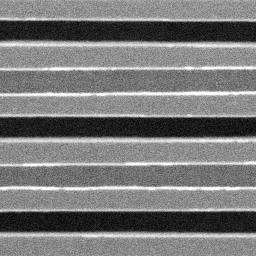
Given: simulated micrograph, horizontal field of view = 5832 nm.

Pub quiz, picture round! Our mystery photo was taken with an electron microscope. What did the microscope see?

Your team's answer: lines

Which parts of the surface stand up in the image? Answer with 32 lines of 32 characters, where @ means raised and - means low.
@@@@@@@@@@@@@@@@@@@@@@@@@@@@@@@@
@@@@@@@@@@@@@@@@@@@@@@@@@@@@@@@@
--------------------@@@@@@@@@@@@
--------------------------------
--------------------------------
--------------------------------
@@@@@@@@@@@@@@@@@@@@@@@@@@@@@@@@
@@@@@@@@@@@@@@@@@@@@@@@@@@@@@@@@
@@@@@@@@@@@@@@@@@@@@@@@@@@@@@@@@
@@@@@@@@@@@@@@@@@@@@@@@@@@@@@@@@
@@@@@@@@@@@@@@@@@@@@@@@@@@@@@@@@
@@@@@@@@@@@@@@@@@@@@@@@@@@@@@@@@
@@@@@@@@@@@@@@@@@@@@@@@@@@@@@@@@
@@@@@@@@@@@@@@@@@@@@@@@@@@@@@@@@
------------@@-@@@@@@@@@@@@@@@@@
--------------------------------
--------------------------------
--------------------------------
@@@@@@@@@@@@@@@@@@@@@@@@@@@@@@@@
@@@@@@@@@@@@@@@@@@@@@@@@@@@@@@@@
@@@@@@@@@@@@@@@@@@@@@@@@@@@@@@@@
@@@@@@@@@@@@@@@@@@@@@@@@@@@@@@@@
@@@@@@@@@@@@@@@@@@@@@@@@@@@@@@@@
@@@@@@@@@@@@@@@@@@@@@@@@@@@@@@@@
@@@@@@@@@@@@@@@@@@@@@@@@@@@@@@@@
@@@@@@@@@@@@@@@@@@@@@@@@@@@@@@@@
--------------------------------
--------------------------------
--------------------------------
@@@@@@@@@@@@@@@@@@@@@@@@@@------
@@@@@@@@@@@@@@@@@@@@@@@@@@@@@@@@
@@@@@@@@@@@@@@@@@@@@@@@@@@@@@@@@